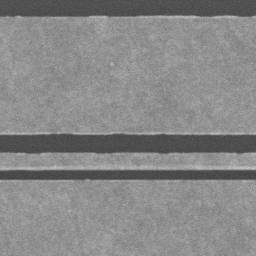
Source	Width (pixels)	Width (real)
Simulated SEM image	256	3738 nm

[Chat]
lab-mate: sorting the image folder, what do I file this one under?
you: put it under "lines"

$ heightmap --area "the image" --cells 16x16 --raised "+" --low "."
................
++++++++++++++++
++++++++++++++++
++++++++++++++++
++++++++++++++++
++++++++++++++++
++++++++++++++++
++++++++++++++++
................
................
++++.........+++
++++++++++++++++
++++++++++++++++
++++++++++++++++
++++++++++++++++
++++++++++++++++